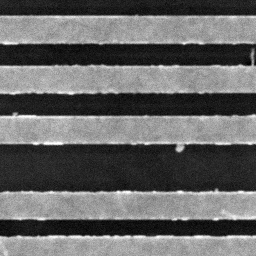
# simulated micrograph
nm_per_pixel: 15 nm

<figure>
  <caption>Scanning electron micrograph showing lines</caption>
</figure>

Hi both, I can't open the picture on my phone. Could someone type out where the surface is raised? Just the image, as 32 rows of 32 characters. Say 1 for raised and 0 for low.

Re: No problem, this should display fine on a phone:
00000000000000000000000000000000
00000000000000000000000000000000
11111111111111111111111111111111
11111111111111111111111111111111
11111111111111111111111111111111
00000000000000000000000000000000
00000000000000000000000000000000
00000000000000000000000000000000
11111111111111111111111111111111
11111111111111111111111111111111
11111111111111111111111111111111
11111111111111111111111111111111
00000000000000000000000000000000
00000000000000000000000000000000
00000000000000000000000000000001
11111111111111111111111111111111
11111111111111111111111111111111
11111111111111111111111111111111
00000000000000000000000000000000
00000000000000000000000000000000
00000000000000000000000000000000
00000000000000000000000000000000
00000000000000000000000000000000
00000000000000000000000000000000
11111111111111111111111111111111
11111111111111111111111111111111
11111111111111111111111111111111
00000000000000000000000000000000
00000000000000000000000000000000
00000000000000000000000000000000
11111111111111111111111111111111
11111111111111111111111111111111